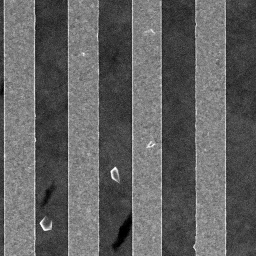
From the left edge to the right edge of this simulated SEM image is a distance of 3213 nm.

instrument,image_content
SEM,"one or a few lines or trenches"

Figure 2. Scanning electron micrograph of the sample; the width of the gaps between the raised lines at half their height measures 426 nanometres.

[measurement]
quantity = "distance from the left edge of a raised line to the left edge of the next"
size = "801 nm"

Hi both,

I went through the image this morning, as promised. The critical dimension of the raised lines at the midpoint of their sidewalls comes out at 377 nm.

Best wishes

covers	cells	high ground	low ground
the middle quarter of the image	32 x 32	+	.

.++++++++........+++++++........
.++++++++........+++++++........
.++++++++........+++++++........
.++++++++........+++++++........
.++++++++........+++++++........
.+++++++.........+++++++........
.+++++++.........+++++++........
.++++++++........+++++++........
.++++++++........+++++++........
.++++++++........+++++++........
.++++++++........+++++++........
.+++++++.........+++++++........
.+++++++.........+++++++........
.++++++++........+++++++........
.++++++++........+++++++........
.++++++++........+++++++........
.+++++++.........+++++++........
.++++++++........+++++++........
.++++++++........+++++++........
.++++++++........+++++++........
.++++++++........+++++++........
.++++++++........+++++++........
.++++++++........+++++++........
.++++++++........+++++++........
.++++++++........+++++++........
.++++++++........+++++++........
.++++++++...+....+++++++........
.++++++++...+....+++++++........
.++++++++...++...+++++++........
.++++++++........+++++++........
.++++++++........+++++++........
.++++++++........+++++++........